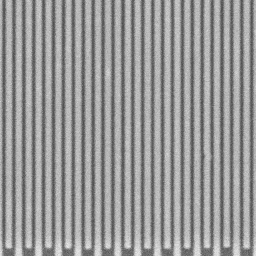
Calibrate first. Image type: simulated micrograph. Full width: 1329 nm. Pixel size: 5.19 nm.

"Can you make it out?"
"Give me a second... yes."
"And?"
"parallel lines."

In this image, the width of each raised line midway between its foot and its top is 34.4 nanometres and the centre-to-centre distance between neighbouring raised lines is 51.4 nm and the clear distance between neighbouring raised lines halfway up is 19.5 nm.